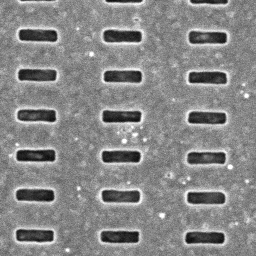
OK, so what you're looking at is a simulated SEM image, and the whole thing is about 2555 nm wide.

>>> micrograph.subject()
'a regular array of holes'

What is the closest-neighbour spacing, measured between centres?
398 nm